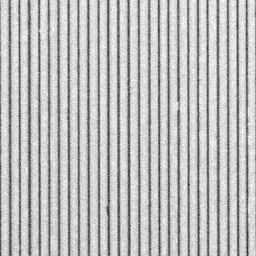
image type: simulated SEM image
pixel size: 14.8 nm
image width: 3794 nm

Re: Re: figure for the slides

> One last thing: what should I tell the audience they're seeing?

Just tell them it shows parallel lines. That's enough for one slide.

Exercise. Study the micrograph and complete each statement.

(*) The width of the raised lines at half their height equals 7.25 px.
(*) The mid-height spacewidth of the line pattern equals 40.8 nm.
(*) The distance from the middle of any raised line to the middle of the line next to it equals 146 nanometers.